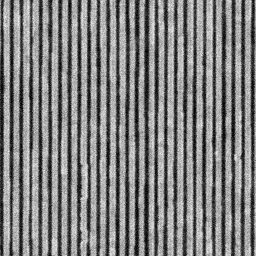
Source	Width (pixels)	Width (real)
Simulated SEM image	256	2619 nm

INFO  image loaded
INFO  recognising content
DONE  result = parallel lines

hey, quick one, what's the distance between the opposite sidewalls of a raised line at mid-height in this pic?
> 44.8 nm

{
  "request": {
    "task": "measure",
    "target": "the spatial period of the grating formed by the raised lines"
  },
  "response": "9.65 px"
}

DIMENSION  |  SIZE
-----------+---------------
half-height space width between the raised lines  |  53.7 nanometers